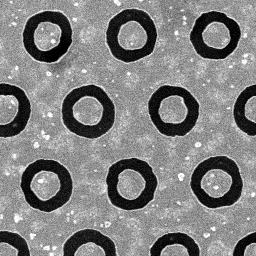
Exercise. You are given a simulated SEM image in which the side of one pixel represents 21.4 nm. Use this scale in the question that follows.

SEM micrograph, a regular array of ring-shaped grooves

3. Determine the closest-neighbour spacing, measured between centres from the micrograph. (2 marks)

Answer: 1790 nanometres